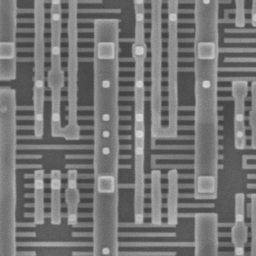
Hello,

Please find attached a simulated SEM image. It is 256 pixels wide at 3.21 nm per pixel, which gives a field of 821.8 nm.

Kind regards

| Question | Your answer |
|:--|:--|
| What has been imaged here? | wiring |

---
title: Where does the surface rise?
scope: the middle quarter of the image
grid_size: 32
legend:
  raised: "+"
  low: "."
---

.++.....+++++.....++..++..++....
.++.....+++++.....++..++..++....
.++.....+++++.....++..++..++....
.++.....+++++.....++..++..++....
.++.....+++++.....++..++..++....
.++.....+++++.....++..++..++....
.++.....+++++.....++..++..++....
.++.....+++++.....++..++..++....
.++.....+++++.....++..++..++....
.++.....+++++.....++..++..++....
.++.....+++++.....++..++..++....
.++.....+++++.....++..++..++....
.++.....+++++.....++..++..++....
.++.....+++++.....++..++..++....
.++.....+++++.....++..++..++....
.+++....+++++.....++..++..++....
++++....+++++.....++..++++++....
++++....+++++.....++..++++++....
++++....+++++.....++............
........++++++....++............
........++++++....++............
........++++++....++............
........+++++.....++............
........+++++.....++............
........+++++.....++............
........+++++.....++............
........+++++.....++.......+....
.++.....+++++.....++..++..++....
.++.....+++++.....++..++..++....
.++.....+++++.....++..++..++....
.++.....+++++.....++..++..++....
+++.....+++++.....++..++..++....